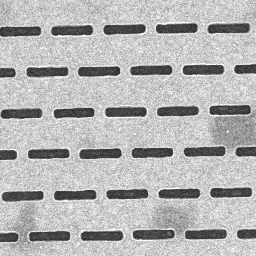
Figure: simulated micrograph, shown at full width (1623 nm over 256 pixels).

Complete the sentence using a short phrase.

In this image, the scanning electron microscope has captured a regular array of holes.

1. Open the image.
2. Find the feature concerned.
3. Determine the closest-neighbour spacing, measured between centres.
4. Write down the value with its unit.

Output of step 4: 306 nanometers